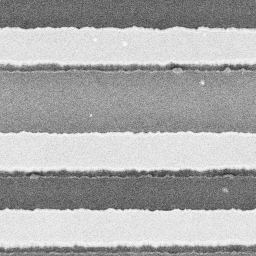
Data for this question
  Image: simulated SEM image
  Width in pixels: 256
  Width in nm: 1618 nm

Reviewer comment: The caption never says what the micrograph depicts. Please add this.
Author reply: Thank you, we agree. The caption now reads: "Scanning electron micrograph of lines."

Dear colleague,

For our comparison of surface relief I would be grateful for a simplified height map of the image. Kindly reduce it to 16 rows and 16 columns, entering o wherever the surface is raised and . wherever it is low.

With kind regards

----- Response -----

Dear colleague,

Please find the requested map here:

................
................
oooooooooooooooo
oooooooooooooooo
................
................
................
................
oooooooooooooooo
oooooooooooooooo
oooooooooooooooo
................
................
oooooooooooooooo
oooooooooooooooo
................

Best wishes